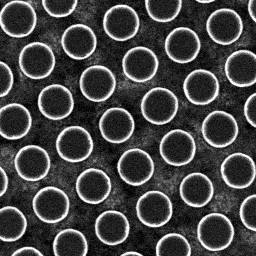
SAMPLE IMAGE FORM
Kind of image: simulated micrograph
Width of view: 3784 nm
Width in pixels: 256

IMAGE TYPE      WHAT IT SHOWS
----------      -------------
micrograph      a regular array of raised bodies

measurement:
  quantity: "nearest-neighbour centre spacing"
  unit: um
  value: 0.675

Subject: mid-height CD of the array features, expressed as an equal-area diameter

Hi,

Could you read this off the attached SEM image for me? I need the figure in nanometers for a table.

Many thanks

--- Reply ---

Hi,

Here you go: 507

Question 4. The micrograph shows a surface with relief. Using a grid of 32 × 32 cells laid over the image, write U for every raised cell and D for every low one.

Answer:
DUUDDUUUUDDDDDDDDDUUUUUDDDDDDDDU
UUUUDDUUUDDDDUUUUDDUUUDDDDDUUDDU
UUUUDDDDDDDDDUUUUDDDUDDDDDUUUUDD
UUUUDDDDDUUDDUUUUDDDDDDDDDUUUUDD
DDUDDDDDUUUUDDUUDDDDDUUUUDUUUUDD
DDDDUDDDUUUUDDDDDDDDDUUUUDDDDDDD
DDDUUUDDUUUDDDDDUUUDDUUUUDDDDDUD
DDDUUUUDDDDDDDDDUUUUDDUUDDDDUUUU
UDDUUUUDDDDUUDDUUUUUDDDDDDDDUUUU
UDDDUUDDDDUUUUDDUUUDDDDDUUUDUUUU
UDDDDDDDDDUUUUDDDDDDDDDUUUUDDUUD
UDDDDUUUUDUUUUDDDDDUUDDUUUUDDDDD
DDDDDUUUUDDDUDDDDDUUUUDDUUDDDDDU
UUUDDUUUUDDDDDDDDDUUUUDDDDDDDDDU
UUUUDDUUDDDDDUUUDDUUUUDDDDUUUDDU
UUUUDDDDDDDDDUUUUDDDDDDDDUUUUUDD
UUUDDDDDUUUDDUUUDDDDDUUDDUUUUUDD
DDDDDDDUUUUDDDUUDDDDUUUUDDUUUDDD
DDDUUDDUUUUDDDDDDDDDUUUUDDDDDDDD
DDUUUUDDUUUDDDDUUUUDUUUUDDDDDUUD
DDUUUUDDDDDDDDDUUUUDDDUDDDDDUUUU
DDUUUUDDDDDUUDDUUUUDDDDDDDDDUUUU
UDDDDDDDDDUUUUDDUUDDDDDUUUDDUUUU
UDDDDDUDDDUUUUDDDDDDDDDUUUUDDDDD
DDDDDUUUDDUUUDDDDDUUUDDUUUDDDDDD
DDDDUUUUUDDDDDDDDUUUUDDDUUDDDDUU
UUDDUUUUDDDDDDDDDUUUUDDDDDDDDDUU
UUUDDUUDDDDDUUUUDDUUUDDDDUUUDDUU
UUUDDDDDDDDDUUUUDDDDDDDDDUUUUDDU
UUUDDDDUUUDDUUUUDDDDDUDDDUUUUDDD
DDDDDDDUUUUDDDDDDDDDUUUDDUUUUDDD
DDUUUDDUUUUDDDDDDDDDUUUUDDDDDDDD